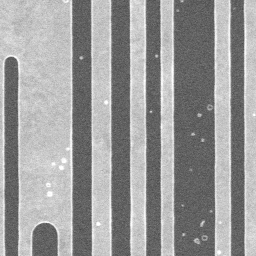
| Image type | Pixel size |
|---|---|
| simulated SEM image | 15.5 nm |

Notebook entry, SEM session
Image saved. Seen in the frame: groups of lines, slits or small figures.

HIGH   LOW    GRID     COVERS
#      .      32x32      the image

#########...##..##..##.....##..#
#########...##..##..##.....##..#
#########...##..##..##.....##..#
#########...##..##..##.....##..#
#########...##..##..##.....##..#
#########...##..##..##.....##..#
#########...##..##..##.....##..#
#.#######...##..##..##.....##..#
..#######...##..##..##.....##..#
..#######...##..##..##.....##..#
..#######...##..##..##.....##..#
..#######...##..##..##.....##..#
..#######...##..##..##.....##..#
..#######...##..##..##.....##..#
..#######...##..##..##.....##..#
..#######...##..##..##.....##..#
..#######...##..##..##.....##..#
..#######...##..##..##.....##..#
..#######...##..##..##.....##..#
..#######...##..##..##.....##..#
..#######...##..##..##.....##..#
..#######...##..##..##.....##..#
..#######...##..##..##.....##..#
..#######...##..##..##.....##..#
..#######...##..##..##.....##..#
#.#######...##...#..##.....##..#
#.#######...##...#..##.....##..#
..#######...##..##..##.....##..#
..##...##...##..##..##.....##..#
..##...##...##..##..##.....##..#
#.##...##...##..##..##.....##..#
#.##...##...##..##..##.....##..#